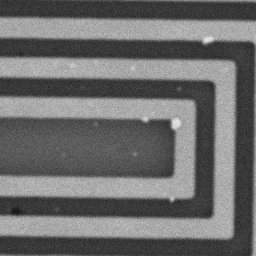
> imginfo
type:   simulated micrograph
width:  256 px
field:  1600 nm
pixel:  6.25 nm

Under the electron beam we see groups of lines, slits or small figures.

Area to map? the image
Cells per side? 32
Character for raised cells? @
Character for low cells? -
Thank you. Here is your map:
--------------------------------
--------------------------------
@@@@@@@@@@@@@-------------------
@@@@@@@@@@@@@@@@@@@@@@@@@@@@@@@@
@@@@@@@@@@@@@@@@@@@@@@@@@@@@@@@@
--------------------------------
--------------------------------
@@@@@@@@@@@@@@@@@@@@@@@---------
@@@@@@@@@@@@@@@@@@@@@@@@@@@@@---
@@@@@@@@@@@@@@@@@@@@@@@@@@@@@---
---------------------------@@---
---------------------------@@---
@@@@@@@@@@@@@@@@@@@@@@-----@@---
@@@@@@@@@@@@@@@@@@@@@@@@---@@---
@@@@@@@@@@@@@@@@@@@@@@@@---@@---
----------------------@@---@@---
----------------------@@---@@---
----------------------@@---@@---
----------------------@@---@@---
----------------------@@---@@---
----------------------@@---@@---
----------------------@@---@@---
@@@@@@@@@@@@@@@@@@@@@@@@---@@---
@@@@@@@@@@@@@@@@@@@@@@@@---@@---
--------@@@@@@@@@@@@@@@@---@@---
---------------------------@@---
---------------------------@@---
@@@@@@@@@@@@@@@@@@@@@@@@@@@@@---
@@@@@@@@@@@@@@@@@@@@@@@@@@@@@---
-------@@@@@@@@@@@@@@@@@@@@@@---
--------------------------------
--------------------------------